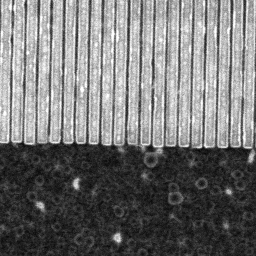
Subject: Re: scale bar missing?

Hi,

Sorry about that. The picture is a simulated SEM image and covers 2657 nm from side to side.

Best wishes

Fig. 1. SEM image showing parallel lines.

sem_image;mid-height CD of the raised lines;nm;48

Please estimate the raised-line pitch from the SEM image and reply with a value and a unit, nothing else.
0.134 µm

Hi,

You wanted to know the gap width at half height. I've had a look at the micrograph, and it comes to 77.8 nm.